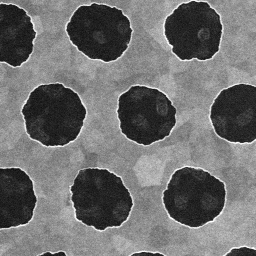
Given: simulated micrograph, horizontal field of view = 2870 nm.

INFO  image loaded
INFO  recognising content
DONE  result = holes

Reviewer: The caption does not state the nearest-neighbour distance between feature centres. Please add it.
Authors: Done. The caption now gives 93.6 px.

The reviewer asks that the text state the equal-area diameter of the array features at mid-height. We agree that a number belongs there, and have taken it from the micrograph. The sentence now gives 679 nanometers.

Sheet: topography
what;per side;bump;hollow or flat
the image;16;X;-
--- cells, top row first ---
-XXXX--XXXX--XXX
--XX----XX----XX
--XX----XX----XX
--XXX--XXXX--XXX
XXXXXXXXXXXXXXXX
XX--XXXX-XXXXX--
XX---XX---XXX---
XX---XX----XX---
XX---XXX--XXXX--
XXXXXXXXXXXXXXXX
XXXXXXXXXXXXXXXX
--XXX---XXX---XX
--XXX---XX----XX
--XXX---XXX---XX
XXXXXXXXXXXXXXXX
XXXXXXXXXXXXXXX-